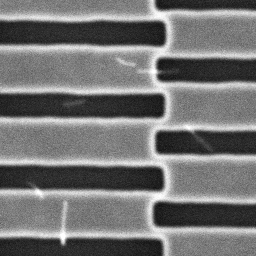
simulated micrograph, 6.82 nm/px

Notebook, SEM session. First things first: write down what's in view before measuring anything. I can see groups of lines, slits or small figures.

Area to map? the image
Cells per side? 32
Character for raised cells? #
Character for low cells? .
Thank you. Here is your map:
###################.............
################################
........##..........############
.....................###########
.....................###########
.....................###########
################################
####################............
###################.............
###################.............
##########################.#####
######..########################
.....................###########
.....................###########
....................############
################################
####################............
###################.............
###################.............
#########################.####..
###..###########################
.....................###########
.....................###########
.....................###########
################################
###################.............
###################.............
###################.............
#####################..##.......
################################
....................############
.....................###########